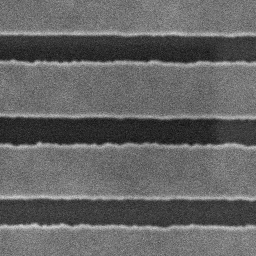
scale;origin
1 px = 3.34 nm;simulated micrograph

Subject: lines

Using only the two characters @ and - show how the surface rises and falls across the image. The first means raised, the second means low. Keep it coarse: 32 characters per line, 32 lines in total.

@@@@@@@@@@@@@@@@@@@@@@@@@@@@@@@@
@@@@@@@@@@@@@@@@@@@@@@@@@@@@@@@@
@@@@@@@@@@@@@@@@@@@@@@@@@@@@@@@@
@@@@@@@@@@@@@@@@@@@@@@@@@@@@@@@@
----------------------------@@--
--------------------------------
--------------------------------
--------------------------------
@@@@@@@@@@@@@@@@@@@@@@@@@@@@@@@@
@@@@@@@@@@@@@@@@@@@@@@@@@@@@@@@@
@@@@@@@@@@@@@@@@@@@@@@@@@@@@@@@@
@@@@@@@@@@@@@@@@@@@@@@@@@@@@@@@@
@@@@@@@@@@@@@@@@@@@@@@@@@@@@@@@@
@@@@@@@@@@@@@@@@@@@@@@@@@@@@@@@@
@@@@@@@@@@@@@@@@@@@@@@@@@@@@@@@@
--------------------------------
--------------------------------
--------------------------------
@@@@@@@@@@@@@@@@@@@@@@@@@@@@@@@@
@@@@@@@@@@@@@@@@@@@@@@@@@@@@@@@@
@@@@@@@@@@@@@@@@@@@@@@@@@@@@@@@@
@@@@@@@@@@@@@@@@@@@@@@@@@@@@@@@@
@@@@@@@@@@@@@@@@@@@@@@@@@@@@@@@@
@@@@@@@@@@@@@@@@@@@@@@@@@@@@@@@@
@@@@@@@@@@@@@@@@@@@@@@@@@@@@@@@@
--------------------------------
--------------------------------
--------------------------------
@@@@@@@@@@@@@@@@@@@@@@@@@@@@@@@@
@@@@@@@@@@@@@@@@@@@@@@@@@@@@@@@@
@@@@@@@@@@@@@@@@@@@@@@@@@@@@@@@@
@@@@@@@@@@@@@@@@@@@@@@@@@@@@@@@@